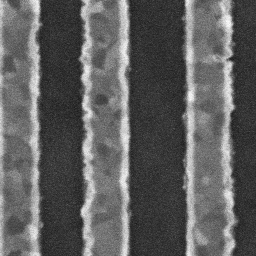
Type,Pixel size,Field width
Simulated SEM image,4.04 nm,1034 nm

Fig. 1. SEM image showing one or a few lines or trenches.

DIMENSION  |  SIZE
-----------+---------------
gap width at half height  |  0.236 microns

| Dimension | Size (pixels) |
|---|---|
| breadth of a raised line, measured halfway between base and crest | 38.8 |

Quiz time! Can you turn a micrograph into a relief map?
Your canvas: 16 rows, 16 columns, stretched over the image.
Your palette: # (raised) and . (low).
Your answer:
##...###....##..
##...###....##..
##...###....##..
##...###....##..
##...###....##..
##...###....##..
##...###....##..
##...###....##..
##....##....##..
##...###....##..
##...###....##..
##....##....##..
##....##....##..
##...###....##..
##...###....##..
##....##....##..